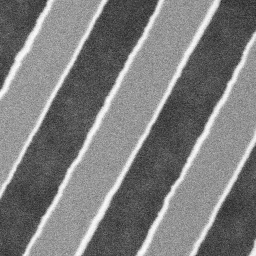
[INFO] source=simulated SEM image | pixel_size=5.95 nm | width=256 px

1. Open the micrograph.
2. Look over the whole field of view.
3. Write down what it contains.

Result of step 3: lines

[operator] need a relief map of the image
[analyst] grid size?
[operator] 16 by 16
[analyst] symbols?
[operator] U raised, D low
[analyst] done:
DDDUUUDDDDUUUDDD
DDUUUUDDDUUUUDDD
DDUUUDDDDUUUDDDD
DUUUUDDDUUUUDDDU
DUUUDDDDUUUDDDDU
UUUUDDDUUUUDDDUU
UUUDDDDUUUDDDDUU
UUUDDDUUUUDDDUUU
UUDDDDUUUDDDDUUU
UDDDDUUUUDDDUUUU
UDDDUUUUDDDDUUUD
DDDDUUUDDDDUUUUD
DDDUUUUDDDUUUUDD
DDDUUUDDDDUUUDDD
DDUUUUDDDUUUUDDD
DDUUUDDDDUUUDDDD